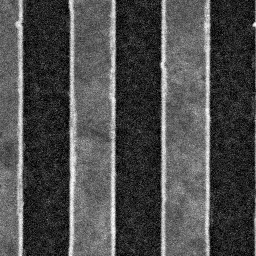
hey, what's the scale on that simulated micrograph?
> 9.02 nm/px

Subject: one or a few lines or trenches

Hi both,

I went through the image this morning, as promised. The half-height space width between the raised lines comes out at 0.455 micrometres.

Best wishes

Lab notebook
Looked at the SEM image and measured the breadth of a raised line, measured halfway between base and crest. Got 393 nanometres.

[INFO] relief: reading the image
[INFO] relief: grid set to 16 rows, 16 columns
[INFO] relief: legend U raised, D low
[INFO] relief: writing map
UDDDUUUDDDUUUDDD
UDDDDUUDDDUUUDDD
UDDDDUUDDDUUUDDD
UDDDDUUDDDUUUDDD
UDDDDUUDDDUUUDDD
UDDDDUUDDDUUUDDD
UDDDUUUDDDUUUDDD
UDDDUUUDDDUUUDDD
UDDDUUUDDDUUUDDD
UDDDDUUDDDUUUDDD
UDDDDUUDDDUUUDDD
UDDDDUUDDDUUUDDD
UDDDDUUDDDUUUDDD
UDDDDUUDDDUUUDDD
UDDDDUUDDDUUUDDD
UDDDUUUDDDUUUDDD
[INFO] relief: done